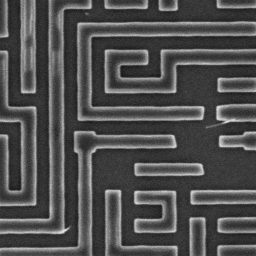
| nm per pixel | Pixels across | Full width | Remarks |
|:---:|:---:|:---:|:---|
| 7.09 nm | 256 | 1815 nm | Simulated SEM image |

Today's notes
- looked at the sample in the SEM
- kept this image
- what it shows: wiring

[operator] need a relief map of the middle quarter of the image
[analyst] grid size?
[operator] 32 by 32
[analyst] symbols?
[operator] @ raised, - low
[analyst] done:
---@@@@---@@@@----------@@@@----
---@@@@---@@@@----------@@@@----
---@@@@---@@@@----------@@@@----
---@@@@---@@@@@@@@@@@@@@@@@@----
---@@@@---@@@@@@@@@@@@@@@@@@----
---@@@@---@@@@@@@@@@@@@@@@@@----
---@@@@---@@@@@@@@@@@@@@@@@@----
---@@@@-------------------------
---@@@@-------------------------
---@@@@-------------------------
---@@@@-------------------------
---@@@@@@@@@@@@@@@@@@@@@@@@@@@@@
---@@@@@@@@@@@@@@@@@@@@@@@@@@@@@
---@@@@@@@@@@@@@@@@@@@@@@@@@@@@@
--------------------------------
--------------------------------
--------------------------------
---@@@@@------------------------
---@@@@@@@@@@@@@@@@@@@@@@@@@----
---@@@@@@@@@@@@@@@@@@@@@@@@@----
---@@@@@@@@@@@@@@@@@@@@@@@@@----
---@@@@@------------------------
---@@@@-------------------------
----@@@-------------------------
----@@@-------------------------
----@@@-----------@@@@@@@@@@@@@@
----@@@-----------@@@@@@@@@@@@@@
----@@@-----------@@@@@@@@@@@@@@
----@@@-------------------------
----@@@-------------------------
----@@@-------------------------
----@@@-------------------------